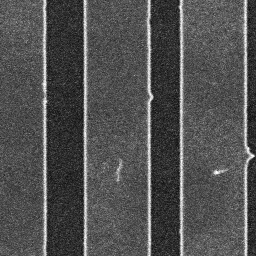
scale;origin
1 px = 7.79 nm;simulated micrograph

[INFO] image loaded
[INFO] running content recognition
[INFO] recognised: one or a few lines or trenches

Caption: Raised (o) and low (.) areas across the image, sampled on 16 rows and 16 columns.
ooo..oooo..oooo.
ooo..oooo..oooo.
ooo..oooo..oooo.
ooo..oooo..oooo.
ooo..oooo..oooo.
ooo..oooo..oooo.
ooo..oooo..oooo.
ooo..oooo..oooo.
ooo..oooo..oooo.
ooo..oooo..ooooo
ooo..oooo..oooo.
ooo..oooo..oooo.
ooo..oooo..oooo.
ooo..oooo..oooo.
ooo..oooo..oooo.
ooo..oooo..oooo.